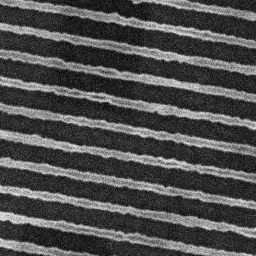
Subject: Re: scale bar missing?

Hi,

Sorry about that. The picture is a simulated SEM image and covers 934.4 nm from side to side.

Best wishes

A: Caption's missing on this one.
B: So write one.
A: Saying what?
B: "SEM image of parallel lines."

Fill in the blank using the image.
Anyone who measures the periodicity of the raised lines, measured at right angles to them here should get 97.1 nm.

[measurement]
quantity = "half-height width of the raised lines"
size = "26.9 nanometres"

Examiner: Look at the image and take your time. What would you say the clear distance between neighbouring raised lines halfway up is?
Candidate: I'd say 70.1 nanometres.